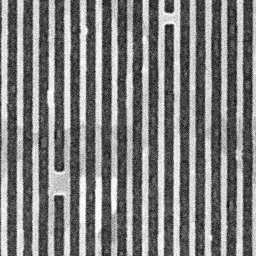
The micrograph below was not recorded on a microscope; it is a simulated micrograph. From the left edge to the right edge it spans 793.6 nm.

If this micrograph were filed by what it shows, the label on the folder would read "parallel lines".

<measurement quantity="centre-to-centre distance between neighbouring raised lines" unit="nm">48.6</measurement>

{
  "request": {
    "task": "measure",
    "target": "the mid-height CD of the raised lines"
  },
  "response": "0.0155 micrometres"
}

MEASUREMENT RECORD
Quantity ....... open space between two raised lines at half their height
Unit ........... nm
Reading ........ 33.7